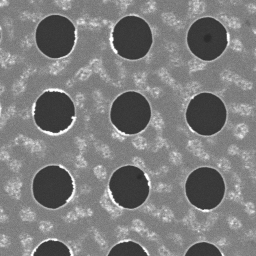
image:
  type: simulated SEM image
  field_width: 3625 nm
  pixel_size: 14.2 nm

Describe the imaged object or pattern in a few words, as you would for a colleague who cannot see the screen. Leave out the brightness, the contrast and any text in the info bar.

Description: a regular array of holes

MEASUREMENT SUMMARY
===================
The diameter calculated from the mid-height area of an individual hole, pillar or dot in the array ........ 592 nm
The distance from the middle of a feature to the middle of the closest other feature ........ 1060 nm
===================